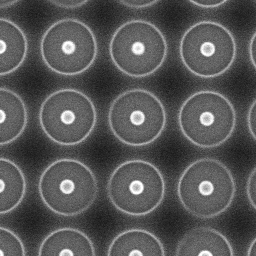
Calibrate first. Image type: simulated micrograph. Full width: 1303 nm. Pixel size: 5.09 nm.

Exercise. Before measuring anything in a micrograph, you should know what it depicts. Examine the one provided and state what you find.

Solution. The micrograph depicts an array of small figures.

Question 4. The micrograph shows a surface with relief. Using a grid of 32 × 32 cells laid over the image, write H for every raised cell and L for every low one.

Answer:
LHHHHHHHLLHHHHHHLLLHHHHHHLLHHHHH
HHHHHHHHHHHHHHHHHHHHHHHHHHHHHHHH
HHHHHHHHHHHHHHHHHHHHHHHHHHHHHHHH
LLHHHHLLLLLHHHHLLLLHHHHHLLLLHHHH
LLLHHHLLLLLLHHLLLLLLHHHLLLLLLHHH
LLLHHLLLHLLLHHLLLLLLLHHLLLLLLHHL
LLLHHLLLHLLLHHLLLHLLLHHLLHHLLHHL
LLLHHHLLLLLLHHLLLLLLHHHLLLLLLHHH
LLHHHHHLLLLHHHHLLLLHHHHHLLLLHHHH
HHHHHHHHHHHHHHHHHHHHHHHHHHHHHHHH
HHHHHHHHHHHHHHHHHHHHHHHHHHHHHHHH
LHHHHHHLLHHHHHHHLLHHHHHHHHHHHHHH
LLHHHHLLLLLHHHHLLLLLHHHHLLLLHHHH
LLLHHLLLLLLLHHLLLLLLHHHLLLLLLHHL
HLLHHLLLHLLLHHLLHHLLHHHLLHLLLHHL
LLLHHLLLLLLLHHLLLLLLHHHLLLLLLHHL
LLLHHHLLLLLHHHLLLLLLHHHLLLLLLHHH
LHHHHHHLLLHHHHHLLLLHHHHHLLLLHHHH
HHHHHHHHHHHHHHHHHHHHHHHHHHHHHHHH
HHHHHHHHHHHHHHHHHHHHHHHHHHHHHHHH
LHHHHHHLLLHHHHHHLLLHHHHHLLLHHHHH
LLHHHHLLLLLHHHLLLLLLHHHLLLLLHHHH
LLLHHLLLLLLLHHLLLLLLHHHLLLLLLHHL
LLLHHLLLHLLLHHLLHHLLHHLLLHHLLHHL
LLLHHLLLLLLLHHLLLLLLHHHLLLLLLHHL
LLHHHHLLLLLHHHLLLLLLHHHLLLLLHHHH
HHHHHHHLLLHHHHHHLLHHHHHHLLLHHHHH
HHHHHHHHHHHHHHHHHHHHHHHHHHHHHHHH
HHHHHHHHHHHHHHHHHHHHHHHHHHHHHHHH
LLHHHHLLLLHHHHHLLLLHHHHHLLLLHHHH
LLLHHLLLLLLHHHLLLLLLHHHLLLLLHHHH
LLLHHLLLHLLLHHLLLLLLHHLLLHLLLHHL